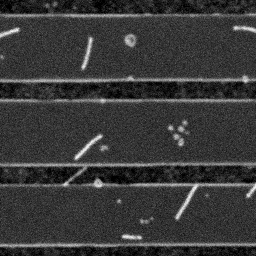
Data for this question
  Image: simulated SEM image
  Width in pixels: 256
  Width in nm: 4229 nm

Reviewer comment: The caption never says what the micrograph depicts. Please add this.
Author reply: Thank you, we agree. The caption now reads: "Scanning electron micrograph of lines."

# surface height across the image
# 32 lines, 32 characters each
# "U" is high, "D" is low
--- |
DDDDDDDDDDDDDDDDDDDDDDDDDDDDDDDD
DDDDDDDDDDDDDDDDDDDDDDDDDDDDDDDD
UUUUUUUUUUUUUUUUUUUUUUUUUUUUUUUU
UUUUUUUUUUUUUUUUUUUUUUUUUUUUUUUU
UUUUUUUUUUUUUUUUUUUUUUUUUUUUUUUU
UUUUUUUUUUUUUUUUUUUUUUUUUUUUUUUU
UUUUUUUUUUUUUUUUUUUUUUUUUUUUUUUU
UUUUUUUUUUUUUUUUUUUUUUUUUUUUUUUU
UUUUUUUUUUUUUUUUUUUUUUUUUUUUUUUU
UUUUUUUUUUUUUUUUUUUUUUUUUUUUUUUU
DDDDDDDDDDDDDDDDDDDDDDDDDDDDDDDD
DDDDDDDDDDDDDDDDDDDDDDDDDDDDDDDD
DDDDDDDDDDDDUDDDDDDDDDDDDDDDDDDD
UUUUUUUUUUUUUUUUUUUUUUUUUUUUUUUU
UUUUUUUUUUUUUUUUUUUUUUUUUUUUUUUU
UUUUUUUUUUUUUUUUUUUUUUUUUUUUUUUU
UUUUUUUUUUUUUUUUUUUUUUUUUUUUUUUU
UUUUUUUUUUUUUUUUUUUUUUUUUUUUUUUU
UUUUUUUUUUUUUUUUUUUUUUUUUUUUUUUU
UUUUUUUUUUUUUUUUUUUUUUUUUUUUUUUU
UUUUUUUUUUUUUUUUUUUUUUUUUUUUUUUU
DDDDDDDDDDDDDDDDDDDDDDDDDDDDDDDD
DDDDDDDDDDDDDDDDDDDDDDDDDDDDDDDD
UUUUUUUUUUUUUUUUUUUUUUUUUUUUUUUU
UUUUUUUUUUUUUUUUUUUUUUUUUUUUUUUU
UUUUUUUUUUUUUUUUUUUUUUUUUUUUUUUU
UUUUUUUUUUUUUUUUUUUUUUUUUUUUUUUU
UUUUUUUUUUUUUUUUUUUUUUUUUUUUUUUU
UUUUUUUUUUUUUUUUUUUUUUUUUUUUUUUU
UUUUUUUUUUUUUUUUUUUUUUUUUUUUUUUU
UUUUUUUUUUUUUUUUUUUUUUUUUUUUUUUU
DDDDDDDDDDDDDDDDDDDDDDDDDDDDDDDD